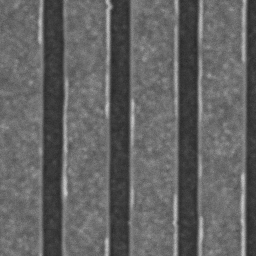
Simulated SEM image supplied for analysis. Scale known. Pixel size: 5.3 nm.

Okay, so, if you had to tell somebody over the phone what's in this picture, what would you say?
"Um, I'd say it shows one or a few lines or trenches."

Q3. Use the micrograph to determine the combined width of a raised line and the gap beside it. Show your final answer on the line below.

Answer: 360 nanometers